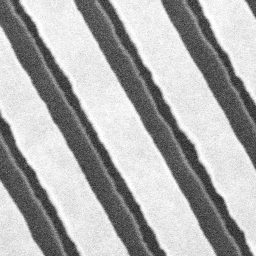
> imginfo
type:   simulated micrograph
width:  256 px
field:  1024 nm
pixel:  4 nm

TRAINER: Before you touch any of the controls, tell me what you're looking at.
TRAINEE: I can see lines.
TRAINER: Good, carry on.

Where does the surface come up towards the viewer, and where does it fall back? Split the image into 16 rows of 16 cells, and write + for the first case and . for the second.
..+++..+++...+++
..+++...+++..+++
...+++..+++...++
+..+++...+++..++
++..+++..+++...+
++...+++..+++..+
+++..+++..++++..
+++...+++..+++..
.+++..+++...+++.
.+++...+++..+++.
..+++..+++...+++
...+++..+++..+++
+..+++...+++..++
+...+++..+++..++
++..+++...+++..+
++...+++..+++...